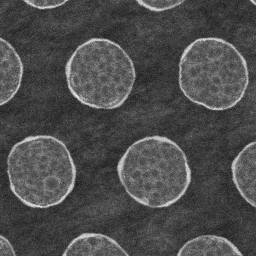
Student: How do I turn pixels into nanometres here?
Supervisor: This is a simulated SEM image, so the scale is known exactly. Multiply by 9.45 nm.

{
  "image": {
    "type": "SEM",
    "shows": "raised bodies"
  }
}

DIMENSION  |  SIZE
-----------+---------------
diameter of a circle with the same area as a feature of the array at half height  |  653 nanometers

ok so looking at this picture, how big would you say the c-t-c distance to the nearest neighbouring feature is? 1060 nanometres